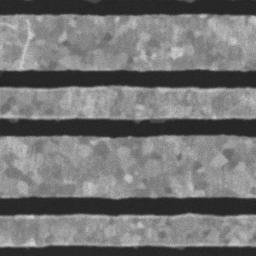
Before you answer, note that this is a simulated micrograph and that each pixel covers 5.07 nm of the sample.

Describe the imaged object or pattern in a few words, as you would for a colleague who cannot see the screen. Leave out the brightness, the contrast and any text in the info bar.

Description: lines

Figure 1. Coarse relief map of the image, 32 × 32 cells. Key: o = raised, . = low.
................................
................................
oooooooooooooooooooooooooooooooo
oooooooooooooooooooooooooooooooo
oooooooooooooooooooooooooooooooo
oooooooooooooooooooooooooooooooo
oooooooooooooooooooooooooooooooo
oooooooooooooooooooooooooooooooo
oooooooooooooooooooooooooooooooo
................................
................................
oooooooooooooooooooooooooooooooo
oooooooooooooooooooooooooooooooo
oooooooooooooooooooooooooooooooo
oooooooooooooooooooooooooooooooo
................................
................................
oooooooooooooooooooooooooooooooo
oooooooooooooooooooooooooooooooo
oooooooooooooooooooooooooooooooo
oooooooooooooooooooooooooooooooo
oooooooooooooooooooooooooooooooo
oooooooooooooooooooooooooooooooo
oooooooooooooooooooooooooooooooo
oooooooooooooooooooooooooooooooo
................................
................................
oooooooooooooooooooooooooooooooo
oooooooooooooooooooooooooooooooo
oooooooooooooooooooooooooooooooo
oooooooooooooooooooooooooooooooo
................................